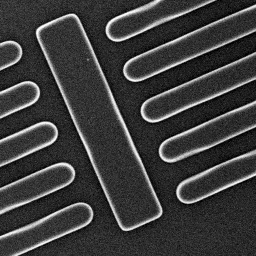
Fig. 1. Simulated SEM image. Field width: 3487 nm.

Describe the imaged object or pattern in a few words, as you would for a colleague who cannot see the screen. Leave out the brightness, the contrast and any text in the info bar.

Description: groups of lines, slits or small figures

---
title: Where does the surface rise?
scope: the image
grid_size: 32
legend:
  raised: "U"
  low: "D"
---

DDDDDDDDDDDDDDDDDDDUUUUUUUDDDDDD
DDDDDDDDDDDDDDDDUUUUUUUUDDDDDDUU
DDDDDDDUUUDDDDUUUUUUUDDDDDDUUUUU
DDDDDUUUUUDDDUUUUUUDDDDDDUUUUUUU
DDDDDUUUUUUDDDUUDDDDDDDUUUUUUUDD
UUDDDUUUUUUDDDDDDDDDDUUUUUUUDDDD
UUUDDUUUUUUUDDDDDDUUUUUUUUDDDDDD
UUDDDDUUUUUUDDDDUUUUUUUUDDDDDDUU
UDDDDDUUUUUUUDDDUUUUUDDDDDDDUUUU
DDDDDDDUUUUUUDDDUUUDDDDDDUUUUUUU
DDUUDDDUUUUUUDDDDDDDDDDUUUUUUUDD
UUUUUDDDUUUUUUDDDDDDDUUUUUUUDDDD
UUUUDDDDUUUUUUDDDDDUUUUUUUDDDDDD
UUUDDDDDUUUUUUUDDDUUUUUDDDDDDDUU
UDDDDDDDDUUUUUUDDDUUUDDDDDDDUUUU
DDDDDUDDDUUUUUUUDDDDDDDDDUUUUUUU
DDDUUUUDDDUUUUUUDDDDDDDUUUUUUUUD
UUUUUUUDDDUUUUUUDDDDDUUUUUUUDDDD
UUUUUDDDDDDUUUUUUDDDUUUUUUDDDDDD
UUUDDDDDDDDUUUUUUDDDUUUDDDDDDDUU
UDDDDDDUDDDDUUUUUUDDDDDDDDDDUUUU
DDDDDUUUUDDDUUUUUUDDDDDDDDUUUUUU
DDUUUUUUUDDDUUUUUUUDDDDUUUUUUUUD
UUUUUUUUDDDDDUUUUUUDDDUUUUUUDDDD
UUUUUDDDDDDDDUUUUUUUDDUUUUDDDDDD
UUUDDDDDDUUDDDUUUUUUDDDDDDDDDDDD
DDDDDDDUUUUUDDUUUUUUDDDDDDDDDDDD
DDDDDUUUUUUDDDDUUUUDDDDDDDDDDDDD
DDDUUUUUUUDDDDDUUDDDDDDDDDDDDDDD
UUUUUUUUDDDDDDDDDDDDDDDDDDDDDDDD
UUUUUDDDDDDDDDDDDDDDDDDDDDDDDDDD
UUUDDDDDDDDDDDDDDDDDDDDDDDDDDDDD